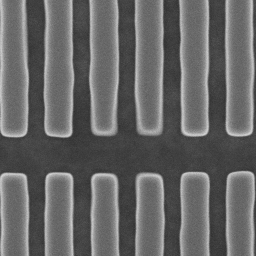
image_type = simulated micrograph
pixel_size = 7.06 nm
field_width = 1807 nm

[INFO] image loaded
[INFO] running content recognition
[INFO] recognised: groups of lines, slits or small figures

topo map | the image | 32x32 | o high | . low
ooo...ooo..oooo..ooo..oooo..oooo
ooo...ooo..oooo..ooo...ooo..oooo
ooo...ooo..oooo..ooo...ooo..oooo
ooo...ooo..oooo..ooo...ooo..oooo
ooo...ooo..oooo..ooo...ooo..oooo
ooo...ooo..oooo..ooo...ooo..oooo
ooo...ooo..oooo..ooo...ooo..oooo
ooo...ooo..oooo..ooo...ooo..oooo
ooo...ooo..oooo..ooo...ooo..oooo
ooo...ooo..oooo..ooo...ooo..oooo
ooo...ooo..oooo..ooo...ooo..oooo
ooo...ooo..oooo..ooo...ooo..oooo
ooo...ooo..ooo...ooo...ooo..oooo
ooo...ooo...oo...ooo...ooo..oooo
ooo...ooo...oo...ooo...ooo..oooo
ooo...ooo...oo...ooo...ooo..oooo
ooo...ooo...oo....oo...ooo...oo.
................................
................................
................................
................................
..............................o.
ooo...ooo...ooo..ooo...ooo..oooo
ooo...ooo...ooo..ooo...ooo..oooo
ooo...ooo...ooo..ooo...ooo..oooo
ooo...ooo...ooo..ooo...ooo..oooo
ooo...ooo..oooo..ooo...ooo..oooo
ooo...ooo..oooo..ooo...ooo..oooo
ooo...ooo..oooo..ooo...ooo..oooo
ooo...ooo..oooo..ooo...ooo..oooo
ooo...ooo..oooo..ooo...ooo...ooo
ooo...ooo...ooo..ooo...ooo...ooo